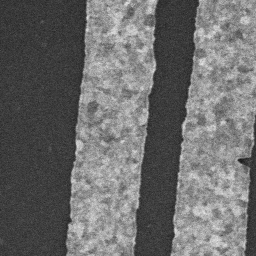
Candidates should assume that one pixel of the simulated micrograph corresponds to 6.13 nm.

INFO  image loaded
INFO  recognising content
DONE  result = one or a few lines or trenches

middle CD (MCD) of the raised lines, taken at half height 406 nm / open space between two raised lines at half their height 241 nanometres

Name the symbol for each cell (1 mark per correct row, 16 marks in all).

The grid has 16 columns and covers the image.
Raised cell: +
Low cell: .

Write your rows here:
.....+++++..++++
.....+++++..++++
.....+++++..++++
.....+++++..++++
.....+++++..++++
.....++++...++++
.....++++...++++
.....++++...++++
.....++++..+++++
.....++++..+++++
.....++++..++++.
....+++++..+++++
....+++++..++++.
....++++...++++.
....++++...++++.
....++++...++++.